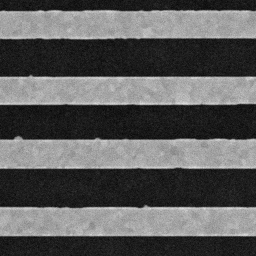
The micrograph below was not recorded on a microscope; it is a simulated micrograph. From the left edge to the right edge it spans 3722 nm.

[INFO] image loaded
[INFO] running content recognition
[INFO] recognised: lines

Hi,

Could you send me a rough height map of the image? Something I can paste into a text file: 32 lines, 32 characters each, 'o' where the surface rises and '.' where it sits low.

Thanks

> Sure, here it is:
................................
oooooooooooooooooooooooooooooooo
oooooooooooooooooooooooooooooooo
oooooooooooooooooooooooooooooooo
oooooooooooooooooooooooooooooooo
................................
................................
................................
................................
................................
oooooooooooooooooooooooooooooooo
oooooooooooooooooooooooooooooooo
oooooooooooooooooooooooooooooooo
................................
................................
................................
................................
......................ooo.ooo..o
oooooooooooooooooooooooooooooooo
oooooooooooooooooooooooooooooooo
oooooooooooooooooooooooooooooooo
................................
................................
................................
................................
................................
oooooooooooooooooooooooooooooooo
oooooooooooooooooooooooooooooooo
oooooooooooooooooooooooooooooooo
................................
................................
................................